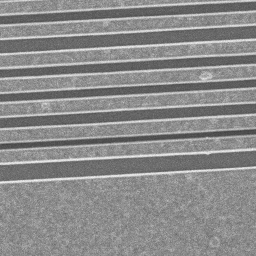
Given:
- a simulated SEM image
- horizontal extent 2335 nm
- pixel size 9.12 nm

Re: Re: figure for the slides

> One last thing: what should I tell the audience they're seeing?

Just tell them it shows parallel lines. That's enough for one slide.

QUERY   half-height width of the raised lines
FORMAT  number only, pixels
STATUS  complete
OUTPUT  13.8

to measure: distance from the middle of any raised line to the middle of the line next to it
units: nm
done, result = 227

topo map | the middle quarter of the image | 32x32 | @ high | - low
--------------------------------
---------------------------@@@@@
---------@@@@@@@@@@@@@@@@@@@@@@@
@@@@@@@@@@@@@@@@@@@@@@@@@@@@@@@@
@@@@@@@@@@@@@@@@@@@@@@@@@@@@@@@-
@@@@@@@@@@@@@@------------------
--------------------------------
-----------------------@@@@@@@@@
-----@@@@@@@@@@@@@@@@@@@@@@@@@@@
@@@@@@@@@@@@@@@@@@@@@@@@@@@@@@@@
@@@@@@@@@@@@@@@@@@@@@@@@@@@@@@@@
@@@@@@@@@@@@@@------------------
--------------------------------
--------------------------------
------------------@@@@@@@@@@@@@@
@@@@@@@@@@@@@@@@@@@@@@@@@@@@@@@@
@@@@@@@@@@@@@@@@@@@@@@@@@@@@@@@@
@@@@@@@@@@@@@@@@@@@@@@----------
@@@@@---------------------------
-------------------@@@@@@@@@@@@@
------@@@@@@@@@@@@@@@@@@@@@@@@@@
@@@@@@@@@@@@@@@@@@@@@@@@@@@@@@@@
@@@@@@@@@@@@@@@@@@@@@@@@@@@@----
@@@@@@@@@@@---------------------
--------------------------------
--------------------------------
--------------------------------
---------------------@@@@@@@@@@@
----@@@@@@@@@@@@@@@@@@@@@@@@@@@@
@@@@@@@@@@@@@@@@@@@@@@@@@@@@@@@@
@@@@@@@@@@@@@@@@@@@@@@@@@@@@@@@@
@@@@@@@@@@@@@@@@@@@@@@@@@@@@@@@@